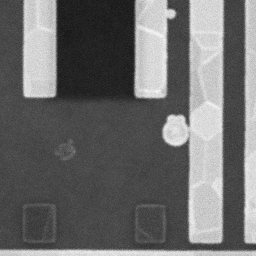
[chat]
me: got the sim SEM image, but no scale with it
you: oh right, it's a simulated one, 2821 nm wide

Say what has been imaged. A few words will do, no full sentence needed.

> wiring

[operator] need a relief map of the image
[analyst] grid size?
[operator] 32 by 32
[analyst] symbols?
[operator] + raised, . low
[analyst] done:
...++++..........++++...++++...+
...++++..........+++++..++++...+
...++++..........++++...++++...+
...++++..........++++...++++...+
...++++..........++++...++++...+
...++++..........++++...++++...+
...++++..........++++...++++...+
...++++..........++++...++++...+
...++++..........++++...++++...+
...++++..........++++...++++...+
...++++..........++++...++++...+
...++++..........++++...++++...+
........................++++...+
........................++++...+
........................++++...+
.....................++.++++...+
.....................+++++++...+
.....................++.++++...+
........+...............++++...+
........................++++...+
........................++++...+
........................++++...+
........................++++...+
........................++++...+
........................++++...+
........................++++...+
...++++..........++++...++++...+
...++++..........++++...++++...+
...++++..........++++...++++...+
...++++..........++++...++++...+
................................
++++++++++++++++++++++++++++++++